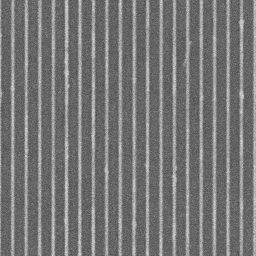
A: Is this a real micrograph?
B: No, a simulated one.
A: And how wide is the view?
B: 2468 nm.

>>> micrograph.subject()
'parallel lines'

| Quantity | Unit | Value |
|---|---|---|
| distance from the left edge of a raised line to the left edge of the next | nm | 130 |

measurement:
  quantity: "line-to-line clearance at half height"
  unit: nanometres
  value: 105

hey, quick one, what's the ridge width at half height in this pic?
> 0.0193 µm